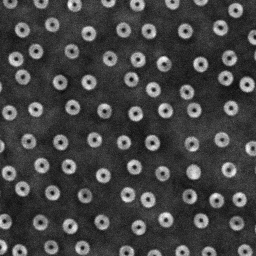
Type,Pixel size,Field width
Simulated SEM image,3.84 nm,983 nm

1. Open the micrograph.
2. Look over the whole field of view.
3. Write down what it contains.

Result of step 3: a regular array of ring-shaped raised bodies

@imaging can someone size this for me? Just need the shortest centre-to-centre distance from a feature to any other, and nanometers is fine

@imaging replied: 99.3